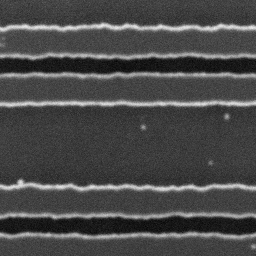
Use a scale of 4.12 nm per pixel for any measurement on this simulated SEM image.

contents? lines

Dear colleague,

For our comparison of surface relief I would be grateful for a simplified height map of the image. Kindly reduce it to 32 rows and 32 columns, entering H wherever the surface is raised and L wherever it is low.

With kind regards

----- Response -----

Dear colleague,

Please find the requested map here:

LLLLLLLLLLLLLLLLLLLLLLLLLLLLLLLL
LLLLLLLLLLLLLLLLLLLLLLLLLLLLLLLL
LLLLLLLLLLLLLLLLLLLLLLLLLLLLLLLL
LHHHHHHHHHHHHHHHHHHHHHHHHHHHHHHH
HHHHHHHHHHHHHHHHHHHHHHHHHHHHHHHH
HHHHHHHHHHHHHHHHHHHHHHHHHHHHHHHH
HHHHHHHHHHHHHHHHHHHHHHHHHHHHHHHH
LLLLLLLLLLLLLLLLLLLLLLLLLLLLLLLL
LLLLLLLLLLLLLLLLLLLLLLLLLLLLLLLL
HHHHHHHHHHHHHHHHHHHHHHHHHHHHHHHH
HHHHHHHHHHHHHHHHHHHHHHHHHHHHHHHH
HHHHHHHHHHHHHHHHHHHHHHHHHHHHHHHH
HHHHHHHHHHHHHHHHHHHHHHHHHHHHHHHH
LLLLLLLLLLLLLLLLLLLLLLLLLLLLLLLL
LLLLLLLLLLLLLLLLLLLLLLLLLLLLLLLL
LLLLLLLLLLLLLLLLLLLLLLLLLLLLLLLL
LLLLLLLLLLLLLLLLLLLLLLLLLLLLLLLL
LLLLLLLLLLLLLLLLLLLLLLLLLLLLLLLL
LLLLLLLLLLLLLLLLLLLLLLLLLLLLLLLL
LLLLLLLLLLLLLLLLLLLLLLLLLLLLLLLL
LLLLLLLLLLLLLLLLLLLLLLLLLLLLLLLL
LLLLLLLLLLLLLLLLLLLLLLLLLLLLLLLL
LLLLLLLLLLLLLLLLLLLLLLLLLLLLLLLL
HHHHHHHHHHHHHHHHHHHHHHHHHHHHHHHH
HHHHHHHHHHHHHHHHHHHHHHHHHHHHHHHH
HHHHHHHHHHHHHHHHHHHHHHHHHHHHHHHH
HHHHHHHHHHHHHHHHHHHHHHHHHHHHHHHH
LLLLLLLLLLLLLLLLLLLLLLLLLLLLLLLL
LLLLLLLLLLLLLLLLLLLLLLLLLLLLLLLL
HHHHHHHHHHHLHHHHHHHHHHHHHHHHHHHH
HHHHHHHHHHHHHHHHHHHHHHHHHHHHHHHH
HHHHHHHHHHHHHHHHHHHHHHHHHHHHHHHH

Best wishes